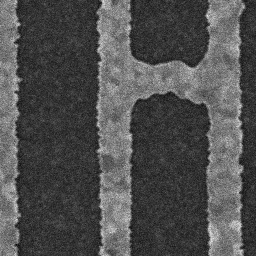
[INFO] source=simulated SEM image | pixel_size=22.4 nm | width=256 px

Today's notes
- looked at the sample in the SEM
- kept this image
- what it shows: one or a few lines or trenches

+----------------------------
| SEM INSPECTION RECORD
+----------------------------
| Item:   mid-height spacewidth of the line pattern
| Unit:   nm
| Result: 1830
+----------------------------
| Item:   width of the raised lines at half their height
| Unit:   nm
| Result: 685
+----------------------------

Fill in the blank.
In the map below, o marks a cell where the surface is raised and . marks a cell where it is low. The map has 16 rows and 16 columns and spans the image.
o.....oo.....oo.
o.....oo.....oo.
o.....oo.....oo.
o.....oo.....oo.
o.....ooooooooo.
o.....ooooooooo.
o.....oo.....oo.
o.....oo.....oo.
o.....oo.....oo.
o.....oo.....oo.
o.....oo.....oo.
o.....oo.....oo.
o.....oo.....oo.
o.....oo.....oo.
o.....oo.....oo.
o.....oo.....oo.